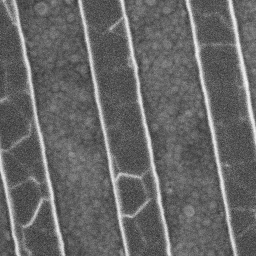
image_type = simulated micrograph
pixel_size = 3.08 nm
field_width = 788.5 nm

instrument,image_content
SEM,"one or a few lines or trenches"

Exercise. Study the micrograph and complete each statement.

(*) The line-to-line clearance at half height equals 193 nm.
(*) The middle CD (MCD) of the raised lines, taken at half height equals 134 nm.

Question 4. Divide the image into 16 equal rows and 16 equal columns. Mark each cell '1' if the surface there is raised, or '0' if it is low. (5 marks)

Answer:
1000011100001100
1000011100001110
1000011100001110
1100001100001110
1100001110000110
1100001110000110
1100001110000111
1100001110000111
1110000110000111
1110000110000111
1110000111000011
1110000111000011
1110000111000011
0110000111000011
0111000011000011
0111000011100001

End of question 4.